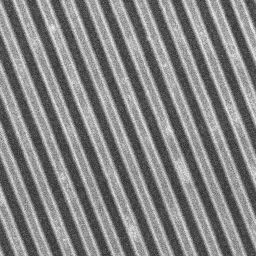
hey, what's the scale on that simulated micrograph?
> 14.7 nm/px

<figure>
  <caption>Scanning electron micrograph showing parallel lines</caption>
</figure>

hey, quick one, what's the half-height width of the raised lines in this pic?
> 0.157 µm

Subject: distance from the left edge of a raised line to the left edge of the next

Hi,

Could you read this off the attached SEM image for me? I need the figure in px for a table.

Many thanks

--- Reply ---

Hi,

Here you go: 22.6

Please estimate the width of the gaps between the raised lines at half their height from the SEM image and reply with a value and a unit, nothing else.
185 nanometres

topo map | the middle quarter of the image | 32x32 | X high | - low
XXX---XX----XXX---XXX---XXX---XX
XXX---XXX---XXX---XXX----XX----X
-XX----XX----XX----XX----XXX---X
-XXX---XXX---XXX---XXX---XXX---X
-XXX----XX---XXX----XX----XX----
--XXX---XXX---XXX---XXX---XXX---
--XXX---XXX---XXX---XXX---XXX---
--XXX----XX----XX----XX----XX---
---XXX---XXX---XXX---XXX---XXX--
---XXX----XX---XXX----XX----XX--
----XX----XXX---XXX---XXX---XXX-
X---XXX---XXX---XXX---XXX---XXX-
X---XXX---XXX----XX----XX----XX-
X----XXX---XXX---XXX---XXX---XXX
XX---XXX---XXX---XXX----XX----XX
XX----XX----XX----XXX---XXX---XX
XXX---XXX---XXX---XXX---XXX---XX
XXX---XXX---XXX---XXX----XX----X
-XX----XXX---XXX---XXX---XXX---X
-XXX---XXX---XXX---XXX---XXX----
--XX----XX----XX----XX----XXX---
--XXX---XXX---XXX---XXX---XXX---
--XXX---XXX---XXX----XX---XXX---
---XX----XXX---XXX---XXX---XXX--
---XXX---XXX---XXX---XXX---XXX--
----XX----XX----XX----XX----XX--
----XX----XXX---XXX---XXX---XXX-
X---XXX---XXX---XXX----XX---XXX-
X----XX----XXX---XXX---XXX---XXX
XX---XXX---XXX---XXX---XXX---XXX
XX---XXX---XXX----XX----XXX---XX
XX----XX----XXX---XXX---XXX---XX